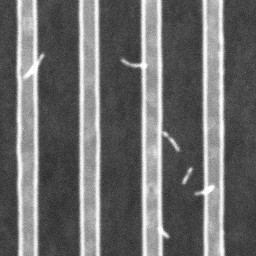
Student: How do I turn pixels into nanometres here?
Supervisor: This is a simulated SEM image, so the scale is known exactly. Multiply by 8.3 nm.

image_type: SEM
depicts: one or a few lines or trenches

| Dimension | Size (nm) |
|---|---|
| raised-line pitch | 514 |